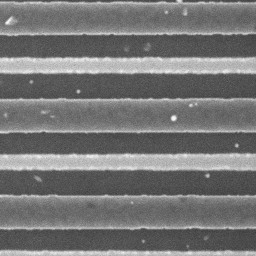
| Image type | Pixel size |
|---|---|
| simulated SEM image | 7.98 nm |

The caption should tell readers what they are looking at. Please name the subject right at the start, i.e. lines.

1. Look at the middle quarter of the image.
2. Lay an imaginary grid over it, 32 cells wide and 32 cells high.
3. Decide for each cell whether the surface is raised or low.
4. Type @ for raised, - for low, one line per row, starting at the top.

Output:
@@@@@@@@@@@@@@@@@@@@@@@@@@@@@@@@
@@@@@@@@@@@@@@@@@@@@@@@@@@@@@@@@
--------------------------------
--------------------------------
--------------------------------
--------------------------------
--------------------------------
--------------------------------
--------------------------------
@@@@@@@@@@@@@@@@@@@@@@@@@@@@@@@@
@@@@@@@@@@@@@@@@@@@@@@@@@@@@@@@@
@@@@@@@@@@@@@@@@@@@@@@@@@@@@@@@@
@@@@@@@@@@@@@@@@@@@@@@@@@@@@@@@@
@@@@@@@@@@@@@@@@@@@@@@@@@@@@@@@@
@@@@@@@@@@@@@@@@@@@@@@@@@@@@@@@@
@@@@@@@@@@@@@@@@@@@@@@@@@@@@@@@@
@@@@@@@@@@@@@@@@@@@@@@@@@@@@@@@@
--------------------------------
--------------------------------
--------------------------------
--------------------------------
--------------------------------
--------------------------------
@@@@@@@@@@@@@@@@@@@@@@@@@@@@@@@@
@@@@@@@@@@@@@@@@@@@@@@@@@@@@@@@@
@@@@@@@@@@@@@@@@@@@@@@@@@@@@@@@@
--------------------------------
--------------------------------
--------------------------------
--------------------------------
--------------------------------
--------------------------------